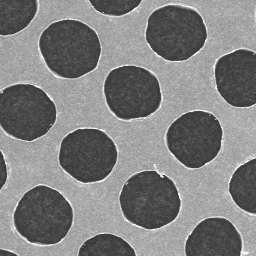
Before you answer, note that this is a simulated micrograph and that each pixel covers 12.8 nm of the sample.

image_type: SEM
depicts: holes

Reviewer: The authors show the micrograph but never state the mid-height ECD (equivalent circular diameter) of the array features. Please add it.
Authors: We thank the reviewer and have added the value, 748 nm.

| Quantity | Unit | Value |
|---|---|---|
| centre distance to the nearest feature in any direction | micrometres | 0.967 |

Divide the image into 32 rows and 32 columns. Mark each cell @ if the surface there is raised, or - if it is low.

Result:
-----@@@@@@------@@@@@@@@@@@@@@@
-----@@@@@@@----@@@------@@@@@@@
----@@@@-@@@@@@@@@@------@@@@@@@
---@@@-----@@@@@@@--------@@@@@@
@@@@@-------@@@@@@--------@@@@@@
@@@@@--------@@@@@@------@@@@@@@
@@@@@--------@@@@@@------@@@@---
@@@@@@------@@@@@@@@@--@@@@-----
@@@@@@------@@@---@@@@@@@@@-----
@@@@@@@---@@@------@@@@@@@@-----
@@@@@@@@@@@@@-------@@@@@@@-----
------@@@@@@@-------@@@@@@@-----
------@@@@@@@-------@@@@@@@@----
-------@@@@@@@------@@@@@@@@@@@@
-------@@@@@@@@---@@@@@----@@@@@
-------@@@@@@@@@@@@@@------@@@@@
@-----@@@----@@@@@@@@-------@@@@
@@@-@@@@------@@@@@@@-------@@@@
@@@@@@@@------@@@@@@@-------@@@@
@@@@@@@--------@@@@@@@-----@@@@@
-@@@@@@-------@@@@@@@@@---@@@@--
-@@@@@@@------@@@@-@@@@@@@@@@---
-@@@@@@@@@---@@@-----@@@@@@@@---
@@@@--@@@@@@@@@-------@@@@@@@---
@@@-----@@@@@@@-------@@@@@@@---
@@-------@@@@@@--------@@@@@@@--
@@-------@@@@@@-------@@@@@@@@@-
@@-------@@@@@@@------@@@@--@@@@
@@-------@@@@@@@@@--@@@@-----@@@
@@@-----@@@@---@@@@@@@@@------@@
@@@@@--@@@------@@@@@@@-------@@
-@@@@@@@@@-------@@@@@@-------@@